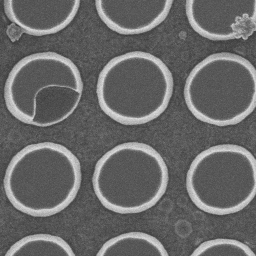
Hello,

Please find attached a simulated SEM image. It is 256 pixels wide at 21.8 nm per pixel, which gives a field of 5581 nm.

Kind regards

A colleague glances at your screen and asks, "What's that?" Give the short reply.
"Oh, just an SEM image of raised bodies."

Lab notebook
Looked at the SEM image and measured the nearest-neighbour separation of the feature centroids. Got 1940 nanometers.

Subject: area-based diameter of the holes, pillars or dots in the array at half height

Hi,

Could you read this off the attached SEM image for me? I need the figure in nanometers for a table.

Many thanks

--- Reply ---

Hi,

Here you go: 1490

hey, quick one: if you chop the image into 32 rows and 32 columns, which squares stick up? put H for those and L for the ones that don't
LHHHHHHHHHLLHHHHHHHHHLLLHHHHHHHH
LHHHHHHHHLLLLHHHHHHHHLLLHHHHHHHH
LLHHHHHHHLLLLHHHHHHHLLLLHHHHHHHH
LLHHHHHLLLLLLLHHHHHLLLLLLHHHHHHH
LLLLLLLLLLLLLLLLLLLLLLLLLLHHHHHL
LLLLLLLLLLLLLLLLLLLLLLLLLLLLLLLL
LLLLLLLLLLLLLLLLLLLLLLLLLLLLLLLL
LLLHHHHHLLLLLLLHHHHLLLLLLLHHHHLL
LLHHHHHHHLLLLHHHHHHHHLLLLHHHHHHL
LHHHHHHHHHLLLHHHHHHHHLLLHHHHHHHH
LHHHHHHHHHLLHHHHHHHHHLLHHHHHHHHH
LHHHHLLLLLLLHHHHHHHHHLLHHHHHHHHH
LHHHLLLLLLLLLHHHHHHHHLLHHHHHHHHH
LHHHLLLLLLLLLHHHHHHHLLLLHHHHHHHL
LLLHLLLLLLLLLLHHHHHLLLLLLHHHHHLL
LLLLLLLLLLLLLLLLLLLLLLLLLLLLLLLL
LLLLLLLLLLLLLLLLLLLLLLLLLLLLLLLL
LLLLLLLLLLLLLLLLLLLLLLLLLLLLLLLL
LLLLHHHLLLLLLLLHHHLLLLLLLLLLLLLL
LLHHHHHHHLLLLHHHHHHHLLLLLHHHHHHL
LLHHHHHHHLLLLHHHHHHHLLLLHHHHHHHH
LHHHHHHHHHLLHHHHHHHHHLLLHHHHHHHH
LHHHHHHHHHLLHHHHHHHHHLLLHHHHHHHH
LHHHHHHHHHLLHHHHHHHHLLLLHHHHHHHH
LHHHHHHHHLLLHHHHHHHHLLLLHHHHHHHH
LLHHHHHHLLLLLHHHHHHLLLLLLHHHHHLL
LLLLHHLLLLLLLLLLLLLLLLLLLLLLLLLL
LLLLLLLLLLLLLLLLLLLLLLLLLLLLLLLL
LLLLLLLLLLLLLLLLLLLLLLLLLLLLLLLL
LLLLLLLLLLLLLLLLHHLLLLLLLLLLLLLL
LLHHHHHHLLLLLLHHHHHHLLLLLLHHHHLL
LHHHHHHHHLLLLHHHHHHHLLLLLHHHHHHL